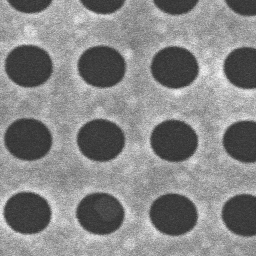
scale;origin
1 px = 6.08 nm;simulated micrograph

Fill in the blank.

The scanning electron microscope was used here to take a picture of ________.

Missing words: a regular array of holes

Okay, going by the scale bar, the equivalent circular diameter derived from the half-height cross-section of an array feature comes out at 280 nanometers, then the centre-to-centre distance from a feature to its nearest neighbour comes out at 444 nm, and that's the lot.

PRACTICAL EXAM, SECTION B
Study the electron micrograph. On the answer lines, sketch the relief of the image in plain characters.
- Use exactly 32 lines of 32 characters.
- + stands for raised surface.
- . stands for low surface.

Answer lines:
+.....++++.....++++......+++....
++...++++++...++++++....+++++...
++++++++++++++++++++++++++++++++
++++++++++++++++++++++++++++++++
++++++++++++++++++++++++++++++++
+++.++++++++++++++++++++++++++++
+.....++++.....+++++....+++++...
+.....++++......+++......+++....
+......+++......+++......+++....
+.....++++.....++++......+++....
++...++++++....+++++....+++++...
++++++++++++++++++++++++++++++++
++++++++++++++++++++++++++++++++
++++++++++++++++++++++++++++++++
++++++++++++++++++++++++++++++++
+....++++++...++++++....+++++...
+.....++++.....++++.....++++....
.......+++......+++......+++....
+.....++++......+++......+++....
++....++++.....+++++....+++++...
++++++++++++++++++++++++++++++++
++++++++++++++++++++++++++++++++
++++++++++++++++++++++++++++++++
++++++++++++++++++++++++++++++++
+....++++++...++++++...++++++...
+.....++++.....++++.....++++....
......+++.......+++......+++....
+.....++++......+++......+++....
+.....++++.....++++.....++++....
+++++++++++++++++++++.++++++++..
++++++++++++++++++++++++++++++++
++++++++++++++++++++++++++++++++